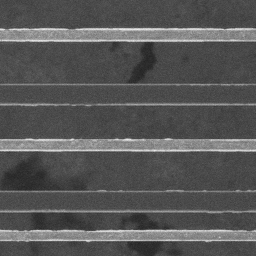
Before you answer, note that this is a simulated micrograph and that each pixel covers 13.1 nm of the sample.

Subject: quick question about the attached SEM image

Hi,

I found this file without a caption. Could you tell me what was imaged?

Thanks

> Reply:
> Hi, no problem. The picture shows lines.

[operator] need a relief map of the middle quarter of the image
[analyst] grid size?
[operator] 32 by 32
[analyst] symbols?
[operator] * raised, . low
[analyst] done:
................................
................................
................................
................................
................................
********************************
********************************
********************************
********************************
********************************
................................
................................
................................
................................
................................
................................
................................
................................
................................
********************************
********************************
********************************
................................
................................
................................
................................
................................
................................
................................
................................
................................
................................